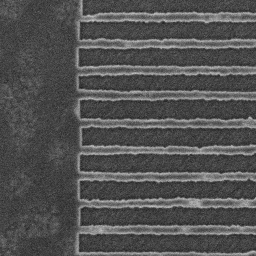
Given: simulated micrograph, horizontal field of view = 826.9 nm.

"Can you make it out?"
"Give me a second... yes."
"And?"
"parallel lines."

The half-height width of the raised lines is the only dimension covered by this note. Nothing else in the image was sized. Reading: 26.6 nm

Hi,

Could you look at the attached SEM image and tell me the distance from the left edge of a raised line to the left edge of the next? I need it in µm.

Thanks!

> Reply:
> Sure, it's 0.0858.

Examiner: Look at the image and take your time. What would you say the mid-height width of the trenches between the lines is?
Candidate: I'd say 58.1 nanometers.